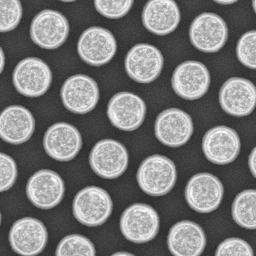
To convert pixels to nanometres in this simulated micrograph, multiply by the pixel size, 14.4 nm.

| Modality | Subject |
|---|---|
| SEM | a regular array of raised bodies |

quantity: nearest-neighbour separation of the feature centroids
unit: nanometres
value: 723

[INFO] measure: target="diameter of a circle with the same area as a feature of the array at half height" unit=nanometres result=515